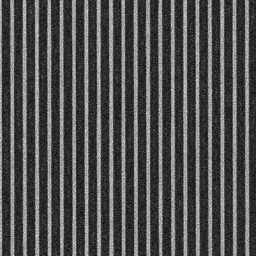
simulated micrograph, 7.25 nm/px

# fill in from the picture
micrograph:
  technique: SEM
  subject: parallel lines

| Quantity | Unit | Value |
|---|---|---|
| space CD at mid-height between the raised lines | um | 0.0698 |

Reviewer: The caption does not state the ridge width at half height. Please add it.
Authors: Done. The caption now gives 19 nanometres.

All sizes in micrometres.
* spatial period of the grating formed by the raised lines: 0.0896